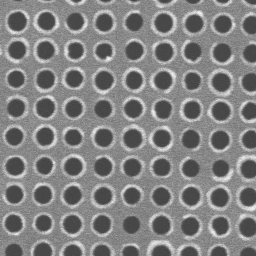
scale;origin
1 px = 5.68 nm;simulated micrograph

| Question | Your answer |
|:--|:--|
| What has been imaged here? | a regular array of holes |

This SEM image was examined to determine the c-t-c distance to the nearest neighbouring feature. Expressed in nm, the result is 162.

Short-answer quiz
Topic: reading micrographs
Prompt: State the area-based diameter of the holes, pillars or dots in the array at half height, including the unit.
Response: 0.103 micrometres